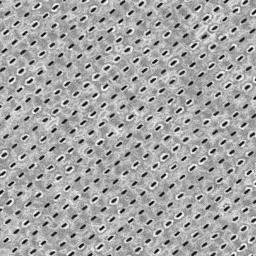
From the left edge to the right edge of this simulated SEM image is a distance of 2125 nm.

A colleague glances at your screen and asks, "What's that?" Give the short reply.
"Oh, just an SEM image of a regular array of holes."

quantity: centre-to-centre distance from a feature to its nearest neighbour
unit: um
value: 0.108